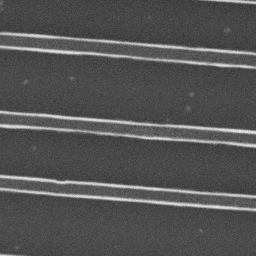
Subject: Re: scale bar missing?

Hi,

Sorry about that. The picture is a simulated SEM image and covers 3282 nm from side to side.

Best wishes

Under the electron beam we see one or a few lines or trenches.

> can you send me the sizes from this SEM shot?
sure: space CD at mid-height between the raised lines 52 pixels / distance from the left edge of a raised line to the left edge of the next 0.914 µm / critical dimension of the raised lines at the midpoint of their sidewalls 177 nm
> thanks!